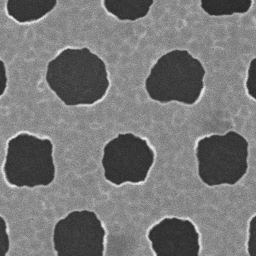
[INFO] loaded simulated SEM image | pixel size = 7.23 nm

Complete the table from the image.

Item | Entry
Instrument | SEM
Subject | holes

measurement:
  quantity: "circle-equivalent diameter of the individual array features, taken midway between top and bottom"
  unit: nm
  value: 388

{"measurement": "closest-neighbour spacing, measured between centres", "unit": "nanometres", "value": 685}